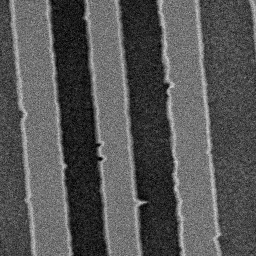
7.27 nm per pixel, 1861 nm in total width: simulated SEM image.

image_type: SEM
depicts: one or a few lines or trenches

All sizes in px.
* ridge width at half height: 38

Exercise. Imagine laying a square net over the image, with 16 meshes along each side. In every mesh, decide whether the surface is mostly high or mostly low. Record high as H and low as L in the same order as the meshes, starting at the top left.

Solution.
LHHLLHHLLLHHLLLL
LHHLLHHHLLHHHLLL
LHHLLLHHLLHHHLLL
LHHLLLHHLLHHHLLL
LHHLLLHHLLHHHLLL
LHHHLLHHLLHHHLLL
LHHHLLHHLLHHHLLL
LHHHLLHHLLLHHLLL
LHHHLLHHLLLHHLLL
LLHHLLHHLLLHHLLL
LLHHLLHHLLLHHLLL
LLHHLLHHLLLHHLLL
LLHHLLHHHLLHHHLL
LLHHLLHHHLLHHHLL
LLHHLLLHHLLHHHLL
LLHHLLLHHLLHHHLL